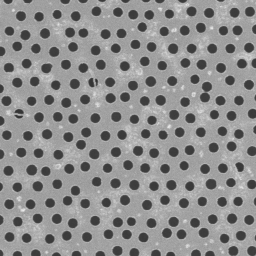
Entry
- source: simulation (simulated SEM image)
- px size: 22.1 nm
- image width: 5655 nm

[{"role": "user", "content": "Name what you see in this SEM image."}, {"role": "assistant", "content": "a regular array of holes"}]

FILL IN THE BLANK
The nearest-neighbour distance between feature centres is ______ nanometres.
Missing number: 368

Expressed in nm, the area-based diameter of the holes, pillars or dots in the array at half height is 222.